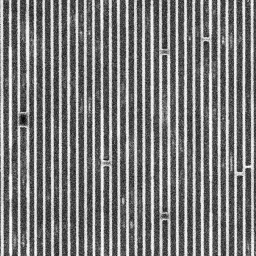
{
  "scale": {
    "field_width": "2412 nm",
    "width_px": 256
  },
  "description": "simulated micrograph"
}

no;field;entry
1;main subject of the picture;parallel lines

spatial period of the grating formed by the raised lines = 78.6 nm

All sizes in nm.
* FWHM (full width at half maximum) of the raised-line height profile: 22.4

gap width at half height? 61.2 nanometers